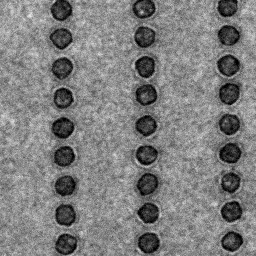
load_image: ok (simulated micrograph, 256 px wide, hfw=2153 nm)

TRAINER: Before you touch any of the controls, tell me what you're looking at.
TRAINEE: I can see a regular array of holes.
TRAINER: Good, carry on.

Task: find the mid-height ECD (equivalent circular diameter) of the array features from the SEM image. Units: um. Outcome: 0.183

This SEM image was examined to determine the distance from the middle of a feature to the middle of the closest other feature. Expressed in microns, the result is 0.246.